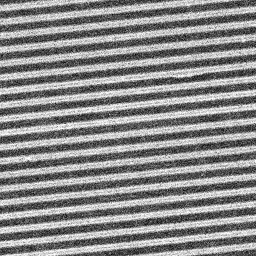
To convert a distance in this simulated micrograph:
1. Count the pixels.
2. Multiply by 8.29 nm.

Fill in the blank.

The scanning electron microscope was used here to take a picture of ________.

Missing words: parallel lines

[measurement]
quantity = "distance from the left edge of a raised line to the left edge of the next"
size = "115 nm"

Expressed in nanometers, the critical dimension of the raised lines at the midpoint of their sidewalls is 48.4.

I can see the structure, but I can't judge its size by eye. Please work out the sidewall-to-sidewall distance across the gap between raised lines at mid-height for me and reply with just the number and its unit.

65.9 nanometers